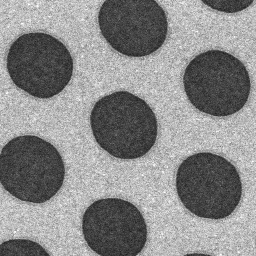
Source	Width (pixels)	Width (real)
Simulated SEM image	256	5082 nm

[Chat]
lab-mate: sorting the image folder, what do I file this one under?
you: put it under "holes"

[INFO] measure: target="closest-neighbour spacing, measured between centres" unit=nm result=2030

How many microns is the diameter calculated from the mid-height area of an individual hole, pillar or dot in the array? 1.32